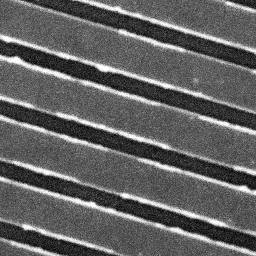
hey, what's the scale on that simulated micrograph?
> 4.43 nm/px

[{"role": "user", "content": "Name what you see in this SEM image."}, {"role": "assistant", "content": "parallel lines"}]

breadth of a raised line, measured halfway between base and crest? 0.184 µm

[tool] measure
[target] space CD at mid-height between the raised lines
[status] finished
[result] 16 px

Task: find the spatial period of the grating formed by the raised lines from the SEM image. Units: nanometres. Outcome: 258